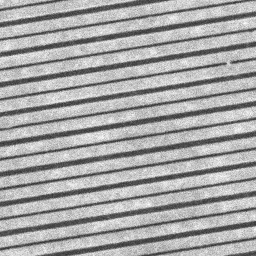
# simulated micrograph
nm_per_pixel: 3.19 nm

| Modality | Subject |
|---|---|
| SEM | parallel lines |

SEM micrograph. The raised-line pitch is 0.0471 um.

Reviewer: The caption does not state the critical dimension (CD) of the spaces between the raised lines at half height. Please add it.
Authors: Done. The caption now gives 12.2 nm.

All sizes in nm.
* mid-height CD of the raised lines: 32.7